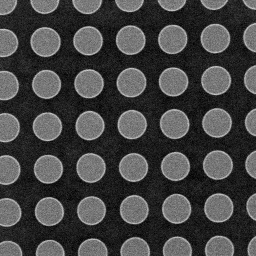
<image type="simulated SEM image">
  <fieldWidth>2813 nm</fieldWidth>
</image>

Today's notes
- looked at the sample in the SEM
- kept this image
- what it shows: an array of small figures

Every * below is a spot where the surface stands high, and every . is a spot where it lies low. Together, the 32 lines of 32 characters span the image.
**..***..****..***..***..***...*
*....*....**....................
................................
..........**...**....**...**...*
**..***..****..***..***..****..*
**..***..****..***..***..****..*
**..***...**...**....*....**....
................................
..........................**...*
**..***...***..***..***..****..*
**..****.****..***..***..****..*
**..***...***..***..***...**...*
................................
................................
**...**...**...***..***...***..*
**..****..***..***..****.****..*
**..****..***..***..***...**...*
*....*..........................
................................
*....**...**....**...**...***..*
**..****..***..***..****.****..*
**..****..***..***..****..***..*
**...**...**....*...............
................................
................*....**...**...*
**...***..***..***..****..***..*
***.****..***..***..****..***..*
**...***..***...**...**...**....
................................
................................
**...**...***..***...***..***..*
***..***..***..****.****..***..*